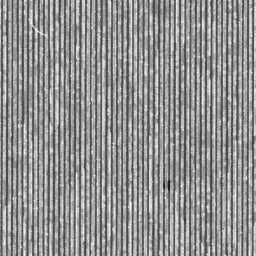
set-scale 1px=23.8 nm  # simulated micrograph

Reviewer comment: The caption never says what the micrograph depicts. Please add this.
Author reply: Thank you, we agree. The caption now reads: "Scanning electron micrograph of parallel lines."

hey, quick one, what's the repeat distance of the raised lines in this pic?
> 125 nm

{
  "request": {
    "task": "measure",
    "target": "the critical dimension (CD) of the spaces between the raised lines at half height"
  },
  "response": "3 px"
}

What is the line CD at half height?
0.0596 microns